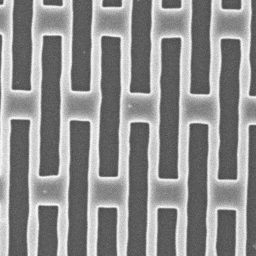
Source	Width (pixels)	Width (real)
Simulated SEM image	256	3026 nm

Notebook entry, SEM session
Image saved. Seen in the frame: groups of lines, slits or small figures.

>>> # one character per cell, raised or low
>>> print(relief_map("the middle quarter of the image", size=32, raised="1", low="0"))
11000001100000111000001100000110
10000001100000110000001100000110
10000001100000111000001100000110
10000001100000111000001100000110
10000001100000110000001100000110
11000001100000110000001100000110
11000001100000110000001100000110
11111111100000111111011100000111
11111111100000111111111100000111
11111111100000111111111100000111
11111111100000111111111100000111
11111111100000111111111100000111
11111111100000111111111100000111
11111111100000111111111100000111
10000001100000111000011100000111
10000001100000110000001100000110
10000001100000110000001000000110
10000001100000110000001000000110
10000001100000110000001100000110
10000001000000110000001100000110
10000001000000110000011100000110
10000001000000110000011000000110
10000001100000110000011000000110
10000011100000110000011000000110
10000011100000110000011000000110
10000011100000110000011000000110
10000011000000110000011000000110
10000011100000110000011000000110
10000011100001110000011100000110
10000011111111110000011111111110
10000011111111110000011111111110
10000011111111110000011111111110